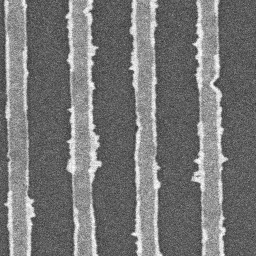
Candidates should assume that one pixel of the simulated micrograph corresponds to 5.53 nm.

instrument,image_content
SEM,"one or a few lines or trenches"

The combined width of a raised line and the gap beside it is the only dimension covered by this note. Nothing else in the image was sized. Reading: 354 nm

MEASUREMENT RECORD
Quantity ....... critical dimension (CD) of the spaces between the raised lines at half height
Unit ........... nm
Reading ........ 238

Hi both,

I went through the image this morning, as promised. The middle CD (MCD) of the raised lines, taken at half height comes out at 0.116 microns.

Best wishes